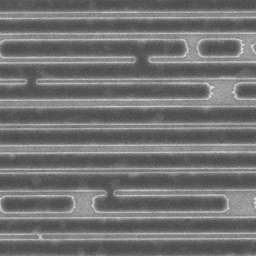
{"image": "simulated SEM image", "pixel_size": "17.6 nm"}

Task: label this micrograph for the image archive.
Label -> parallel lines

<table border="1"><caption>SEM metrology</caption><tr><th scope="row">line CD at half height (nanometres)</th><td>305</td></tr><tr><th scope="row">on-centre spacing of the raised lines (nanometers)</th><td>390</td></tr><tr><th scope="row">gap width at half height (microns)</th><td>0.0812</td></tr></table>